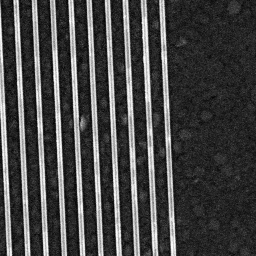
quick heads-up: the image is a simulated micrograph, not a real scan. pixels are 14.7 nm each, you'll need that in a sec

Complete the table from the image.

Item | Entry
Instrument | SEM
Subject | parallel lines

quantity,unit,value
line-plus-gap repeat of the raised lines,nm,266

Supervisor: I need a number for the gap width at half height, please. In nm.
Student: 216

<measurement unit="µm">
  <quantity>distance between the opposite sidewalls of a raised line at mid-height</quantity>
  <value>0.0512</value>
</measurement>